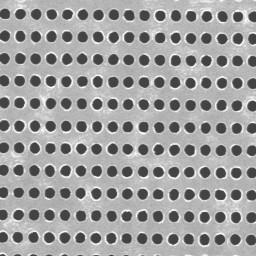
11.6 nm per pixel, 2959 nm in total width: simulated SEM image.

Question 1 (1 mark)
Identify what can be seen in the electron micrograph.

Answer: a regular array of holes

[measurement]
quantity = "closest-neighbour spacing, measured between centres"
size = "177 nanometers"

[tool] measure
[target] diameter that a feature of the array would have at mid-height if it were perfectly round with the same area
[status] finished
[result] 0.127 um